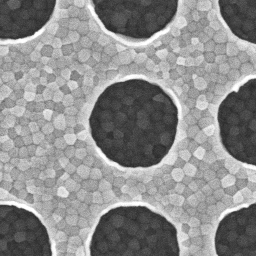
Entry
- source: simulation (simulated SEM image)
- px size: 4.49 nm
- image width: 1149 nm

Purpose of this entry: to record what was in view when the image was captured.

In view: holes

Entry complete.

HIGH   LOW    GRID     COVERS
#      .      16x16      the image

...###.....###..
...###.....###..
########.######.
################
################
#######...#####.
######.....###..
######.....###..
######.....###..
######.....###..
################
################
################
..####....####..
...###.....##...
...###.....##...